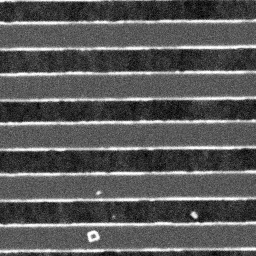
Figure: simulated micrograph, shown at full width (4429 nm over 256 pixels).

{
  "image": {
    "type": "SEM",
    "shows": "lines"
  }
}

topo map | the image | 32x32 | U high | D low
DDDDDDDDDDDDDDDDDDDDDDDDDDDDDDDD
DDDDDDDDDDDDDDDDDDDDDDDDDDDDDDDD
DDDDDDDDDDDDDDDDDDDDDDDDDDDDDDDU
UUUUUUUUUUUUUUUUUUUUUUUUUUUUUUUU
UUUUUUUUUUUUUUUUUUUUUUUUUUUUUUUU
UUUUUUUUUUUUUUUUUUUUUUUUUUUUUUUU
DDDDDDDDDDDDDDDDDDDDDDDDDDDDDDDD
DDDDDDDDDDDDDDDDDDDDDDDDDDDDDDDD
DDDDDDDDDDDDDDDDDDDDDDDDDDDDDDDD
UUUUUUUUUUUUUUUUUUUUUUUUUUUUUUUU
UUUUUUUUUUUUUUUUUUUUUUUUUUUUUUUU
UUUUUUUUUUUUUUUUUUUUUUUUUUUUUUUU
UUUUUUUUUUDDDDDDDDDDDDDDDDDDDDDD
DDDDDDDDDDDDDDDDDDDDDDDDDDDDDDDD
DDDDDDDDDDDDDDDDDDDDDDDDDDDDDDDD
UUUUUUUUUUUUUUUUUUUUUUUUUUUUUUUU
UUUUUUUUUUUUUUUUUUUUUUUUUUUUUUUU
UUUUUUUUUUUUUUUUUUUUUUUUUUUUUUUU
UUUUUUUUUUUUUUUUUUUUUUUUUUUUUUUD
DDDDDDDDDDDDDDDDDDDDDDDDDDDDDDDD
DDDDDDDDDDDDDDDDDDDDDDDDDDDDDDDD
DDDDDDDDDDDDDDDDDDDDDDDDDDDDDDUU
UUUUUUUUUUUUUUUUUUUUUUUUUUUUUUUU
UUUUUUUUUUUUUUUUUUUUUUUUUUUUUUUU
UUUUUUUUUUUUUUUUUUUUUUUUUUUUUUUU
DDDDDDDDDDDDDDDDDDDDDDDDDDDDDDDD
DDDDDDDDDDDDDDDDDDDDDDDDDDDDDDDD
DDDDDDDDDDDDDDDDDDDDDDDDDDDDDDDD
UUUUUUUUUUUUUUUUUUUUUUUUUUUUUUUU
UUUUUUUUUUUUUUUUUUUUUUUUUUUUUUUU
UUUUUUUUUUUUUUUUUUUUUUUUUUUUUUUU
UUDDDDDDDDDDDDDDDDDDDDDDDDDDDDDD